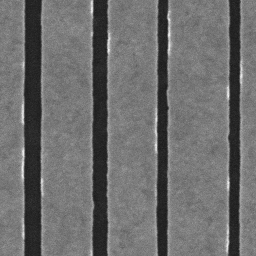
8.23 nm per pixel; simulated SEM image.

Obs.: one or a few lines or trenches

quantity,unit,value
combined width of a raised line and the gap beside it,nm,542